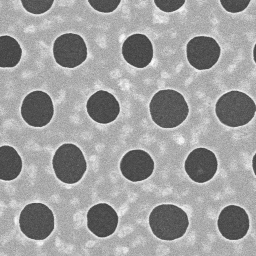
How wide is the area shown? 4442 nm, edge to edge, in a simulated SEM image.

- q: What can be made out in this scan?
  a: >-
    a regular array of holes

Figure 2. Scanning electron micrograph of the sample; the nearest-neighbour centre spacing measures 1120 nm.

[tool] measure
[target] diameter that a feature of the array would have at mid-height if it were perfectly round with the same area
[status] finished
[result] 0.596 um